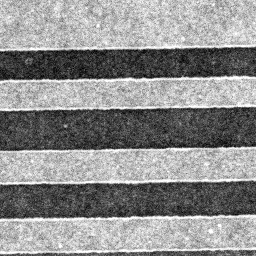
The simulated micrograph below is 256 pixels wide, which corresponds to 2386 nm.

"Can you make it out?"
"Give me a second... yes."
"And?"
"lines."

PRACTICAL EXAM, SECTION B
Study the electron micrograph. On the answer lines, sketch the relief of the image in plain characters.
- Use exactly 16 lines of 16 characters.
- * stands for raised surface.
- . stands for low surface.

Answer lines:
****************
****************
****************
................
................
****************
****************
................
................
****************
****************
................
................
................
****************
****************